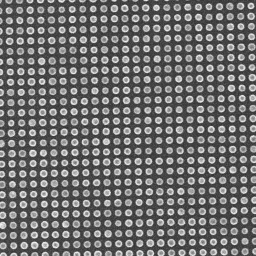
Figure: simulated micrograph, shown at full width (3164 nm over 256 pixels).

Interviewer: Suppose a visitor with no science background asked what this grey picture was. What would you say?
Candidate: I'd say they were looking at a regular array of raised bodies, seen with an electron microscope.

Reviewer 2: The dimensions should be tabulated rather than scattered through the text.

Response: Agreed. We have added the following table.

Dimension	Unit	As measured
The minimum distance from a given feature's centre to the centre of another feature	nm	125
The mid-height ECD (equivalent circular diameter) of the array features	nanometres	78.9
